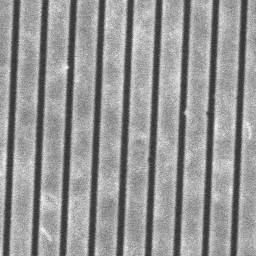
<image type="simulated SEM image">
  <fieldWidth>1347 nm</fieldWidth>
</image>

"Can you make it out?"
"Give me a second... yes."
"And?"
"parallel lines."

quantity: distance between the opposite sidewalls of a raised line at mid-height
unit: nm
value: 114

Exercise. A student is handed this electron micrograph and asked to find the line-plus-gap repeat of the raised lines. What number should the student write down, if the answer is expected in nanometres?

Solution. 150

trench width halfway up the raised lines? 34.8 nanometers